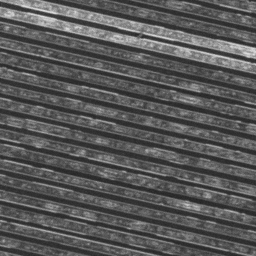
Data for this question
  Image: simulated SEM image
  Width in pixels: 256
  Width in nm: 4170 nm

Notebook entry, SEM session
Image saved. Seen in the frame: parallel lines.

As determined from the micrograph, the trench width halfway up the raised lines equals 93.3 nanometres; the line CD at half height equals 139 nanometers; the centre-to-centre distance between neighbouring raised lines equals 243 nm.